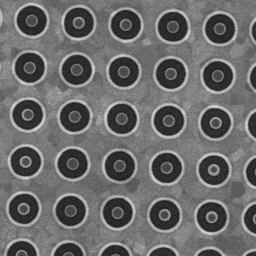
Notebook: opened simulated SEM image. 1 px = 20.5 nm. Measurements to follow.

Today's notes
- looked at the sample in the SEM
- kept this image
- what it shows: an array of small figures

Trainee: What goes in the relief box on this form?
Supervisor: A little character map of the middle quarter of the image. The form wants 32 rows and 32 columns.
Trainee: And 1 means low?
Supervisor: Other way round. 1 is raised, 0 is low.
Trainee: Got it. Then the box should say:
00110001111000000001111000000011
00111001111000110001111000110001
00110001111000110001111001110001
00000001111000000001111000100001
00000011111100000011111000000011
11001111111110000111111100000111
11111111111111111111111111011111
11111111111111111111111111111111
11111111111111111111111111111111
10001111111111111111111111111111
00000011111100000111111100001111
00000011111000000011111000000111
00110001111000000011110000000011
01110001110001110001110001100011
00100001110001100011110001100011
00000011111000000011110000100011
00000111111000000111111000000111
11111111111110001111111100000111
11111111111111111111111111111111
11111111111111111111111111111111
11111111111111111111111111111111
00001111111110111111111111111111
00000111111000000111111100001111
00000011110000000011110000000111
01110011110001100011110000000011
01100011110001100011100011100011
00000011110001100011110011100011
00000111110000000111110000000111
00001111111000000111110000000111
11111111111110011111111000001111
11111111111111111111111111111111
11111111111111111111111111111111